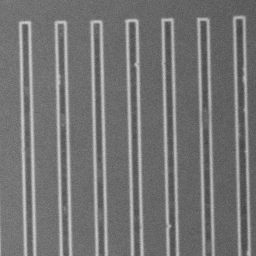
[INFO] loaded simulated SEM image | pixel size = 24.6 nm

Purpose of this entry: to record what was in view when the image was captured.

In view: parallel lines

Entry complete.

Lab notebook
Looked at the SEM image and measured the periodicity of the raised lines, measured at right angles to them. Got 0.878 microns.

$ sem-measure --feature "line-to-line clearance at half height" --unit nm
218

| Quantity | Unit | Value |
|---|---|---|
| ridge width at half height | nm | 658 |